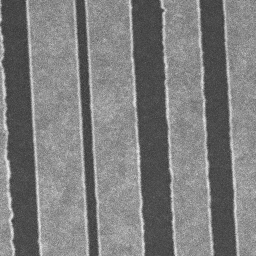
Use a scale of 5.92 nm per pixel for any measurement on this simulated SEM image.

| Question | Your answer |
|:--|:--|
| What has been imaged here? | one or a few lines or trenches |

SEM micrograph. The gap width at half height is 166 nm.